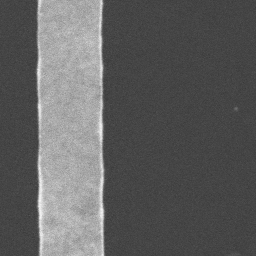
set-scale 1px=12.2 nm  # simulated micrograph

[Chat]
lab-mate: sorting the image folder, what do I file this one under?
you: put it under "wiring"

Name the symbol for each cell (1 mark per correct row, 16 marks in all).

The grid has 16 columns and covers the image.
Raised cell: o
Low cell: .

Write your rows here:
..oooo..........
..oooo..........
..oooo..........
..oooo..........
..oooo..........
..oooo..........
..oooo..........
..oooo..........
..oooo..........
..oooo..........
..oooo..........
..oooo..........
..oooo..........
..oooo..........
..oooo..........
...ooo..........